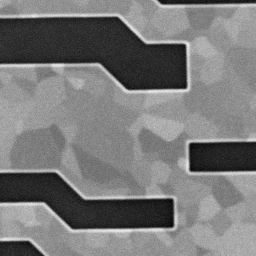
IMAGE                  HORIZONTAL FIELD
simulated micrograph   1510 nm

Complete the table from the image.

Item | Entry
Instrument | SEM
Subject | groups of lines, slits or small figures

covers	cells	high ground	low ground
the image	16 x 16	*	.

****************
........********
.........*******
............****
*******.....****
********...*****
****************
****************
****************
************....
************....
....************
...........*****
****.......*****
****************
..**************